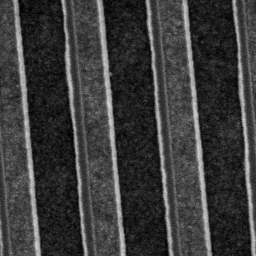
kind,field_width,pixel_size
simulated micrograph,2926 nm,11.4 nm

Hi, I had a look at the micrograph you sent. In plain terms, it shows lines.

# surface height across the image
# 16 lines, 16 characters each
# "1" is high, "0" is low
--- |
1000110001110001
1000110001110001
1000110001110001
1000111000110001
1000111000110001
1000111000110001
1100011000110001
1100011000110001
1100011000110001
1100011000110001
1100011000111001
1100011000111000
1100011000111000
1100011000111000
1100011100011000
1100011100011000